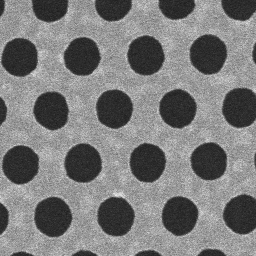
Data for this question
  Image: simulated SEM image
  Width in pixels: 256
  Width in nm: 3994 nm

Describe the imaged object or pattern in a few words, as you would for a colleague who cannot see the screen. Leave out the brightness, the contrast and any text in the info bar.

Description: a regular array of holes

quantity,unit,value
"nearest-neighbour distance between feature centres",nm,960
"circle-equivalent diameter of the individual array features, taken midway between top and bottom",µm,0.604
